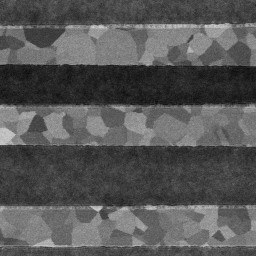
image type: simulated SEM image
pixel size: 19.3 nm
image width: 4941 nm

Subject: lines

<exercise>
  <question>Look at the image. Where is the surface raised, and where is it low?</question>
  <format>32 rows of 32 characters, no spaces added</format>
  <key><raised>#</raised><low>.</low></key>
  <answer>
................................
................................
................................
################################
################################
################################
################################
################################
................................
................................
................................
................................
................................
################################
################################
################################
################################
################################
................................
................................
................................
................................
................................
................................
................................
................................
################################
################################
################################
################################
################################
................................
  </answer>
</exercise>